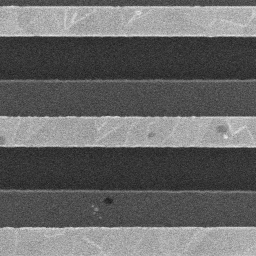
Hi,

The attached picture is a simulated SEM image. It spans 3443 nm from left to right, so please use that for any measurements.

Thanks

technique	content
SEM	lines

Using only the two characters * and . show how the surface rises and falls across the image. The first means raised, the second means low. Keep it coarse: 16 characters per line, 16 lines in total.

****************
****************
................
................
................
****************
****************
****************
****************
................
................
................
****************
****************
****************
****************